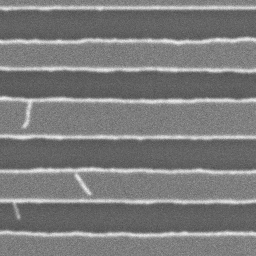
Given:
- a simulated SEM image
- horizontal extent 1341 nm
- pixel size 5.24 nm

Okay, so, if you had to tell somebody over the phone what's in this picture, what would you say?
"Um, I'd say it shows lines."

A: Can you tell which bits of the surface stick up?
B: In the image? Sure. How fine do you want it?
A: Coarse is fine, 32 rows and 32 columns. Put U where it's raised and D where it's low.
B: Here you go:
UUUUUUUUUUUUUUUUUUUUUUUUUUUUUUUU
DDDDDDDDDDDDDDDDDDDDDDDDDDDDDDDD
DDDDDDDDDDDDDDDDDDDDDDDDDDDDDDDD
DDDDDDDDDDDDDDDDDDDDDDDDDDDDDDDD
DDDDDDDDDDDDDDDDDDDDDDDDDDDDDDDD
UUUUUUUUUUUUUUUUUUUUUUUUUUUUUUUU
UUUUUUUUUUUUUUUUUUUUUUUUUUUUUUUU
UUUUUUUUUUUUUUUUUUUUUUUUUUUUUUUU
UUUUUUUUUUUUUUUUUUUUUUUUUUUUUUUU
DDDDDDDDDDDDDDDDDDDDDDDDDDDDDDDD
DDDDDDDDDDDDDDDDDDDDDDDDDDDDDDDD
DDDDDDDDDDDDDDDDDDDDDDDDDDDDDDDD
UUUUUUUUUUUUUUUDDDDDDDDDUUUUUDUU
UUUUUUUUUUUUUUUUUUUUUUUUUUUUUUUU
UUUUUUUUUUUUUUUUUUUUUUUUUUUUUUUU
UUUUUUUUUUUUUUUUUUUUUUUUUUUUUUUU
UUUUUUUUUUUUUUUUUUUUUUUUUUUUUUUU
DDDDDDDDDDDDDDDDDDDDDDDDDDDDDDDD
DDDDDDDDDDDDDDDDDDDDDDDDDDDDDDDD
DDDDDDDDDDDDDDDDDDDDDDDDDDDDDDDD
DDDDDDDDDDDDDDDDDDDDDDDDDDDDDDDD
UUUUUUUUUUUUUUUUUUUUUUUUUUUUUUUU
UUUUUUUUUUUUUUUUUUUUUUUUUUUUUUUU
UUUUUUUUUUUUUUUUUUUUUUUUUUUUUUUU
UUUUUUUUUUUUUUUUUUUUUUUUUUUUUUUU
DDDDDDDDDDDDDDDDDDDDDDDDDDDDDDDD
DDDDDDDDDDDDDDDDDDDDDDDDDDDDDDDD
DDDDDDDDDDDDDDDDDDDDDDDDDDDDDDDD
DDDDDDDDDDDDDDDDDDDDDDDDDDDDDDDD
UUUUUUUUUUUUUUUUUUUUUUUUUUUUUUUU
UUUUUUUUUUUUUUUUUUUUUUUUUUUUUUUU
UUUUUUUUUUUUUUUUUUUUUUUUUUUUUUUU